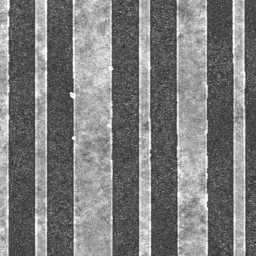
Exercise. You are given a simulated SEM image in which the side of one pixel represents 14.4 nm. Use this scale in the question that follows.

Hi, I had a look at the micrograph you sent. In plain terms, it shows lines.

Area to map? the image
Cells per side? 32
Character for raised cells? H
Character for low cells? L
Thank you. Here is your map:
HLLLHHLLLHHHHHLLLHHLLLHHHHLLLHLL
HLLLHHLLLHHHHHLLLHHLLLHHHHLLLHLL
HLLLHHLLLHHHHHLLLHHLLLHHHHLLLHLL
HLLLHHLLLHHHHHLLLHHLLLHHHHLLLHLL
HLLLHHLLLHHHHHLLLHHLLLHHHHLLLHLL
HLLLHHLLLHHHHHLLLHHLLLHHHHLLLHLL
HLLLHHLLLHHHHHLLLHHLLLHHHHLLLHLL
HLLLHHLLLHHHHHLLLHHLLLHHHHLLLHLL
HLLLHHLLLHHHHHLLLHHLLLHHHHLLLHLL
HLLLHHLLLHHHHHLLLHHLLLHHHHLLLHHL
HLLLHHLLLHHHHHLLLHHLLLHHHHLLLHHL
HLLLHHLLLHHHHHLLLHHLLLHHHHLLLHLL
HLLLHHLLLHHHHHLLLHHLLLHHHHLLLHLL
HLLLHHLLLHHHHHLLLHHLLLHHHHLLLHLL
HLLLHHLLLHHHHHLLLHHLLLHHHHLLLHHL
HLLLHHLLLHHHHHLLLHHLLLHHHHLLLHHL
HLLLHHLLLHHHHHLLLHHLLLHHHHLLLHHL
HLLLHHLLLHHHHHLLLHHLLLHHHHLLLHHL
HLLLHHLLLHHHHHLLLHHLLLHHHHLLLHHL
HLLLHHLLLHHHHHLLLHHLLLHHHHLLLHHL
HLLLHHLLLHHHHHLLLHHLLLHHHHLLLHHL
HLLLHHLLLHHHHHLLLHHLLLHHHHLLLHHL
HLLLHHLLLHHHHHLLLHHLLLHHHHLLLHHL
HLLLHHLLLHHHHHLLLHHLLLHHHHLLLHHL
HLLLHHLLLHHHHHLLLHHLLLHHHHLLLHHL
HLLLHHLLLHHHHHLLLHHLLLHHHHLLLHHL
HLLLHHLLLHHHHHLLLHHLLLHHHHLLLHHL
HLLLHHLLLHHHHHLLLHHLLLHHHHLLLHHL
HLLLHHLLLHHHHHLLLHHLLLHHHHLLLHHL
HLLLHHLLLHHHHHLLLHHLLLHHHHLLLHHL
HLLLHHLLLHHHHHLLLHHLLLHHHHLLLHHL
HLLLHHLLLHHHHHLLLHHLLLHHHHLLLHHL